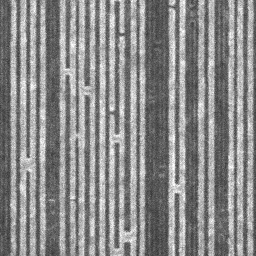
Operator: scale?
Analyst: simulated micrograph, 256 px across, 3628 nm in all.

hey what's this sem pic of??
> parallel lines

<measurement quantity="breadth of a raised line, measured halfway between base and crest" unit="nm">60.2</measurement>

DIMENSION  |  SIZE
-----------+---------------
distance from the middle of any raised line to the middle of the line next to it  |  0.14 um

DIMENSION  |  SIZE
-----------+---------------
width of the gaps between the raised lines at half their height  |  74.4 nanometers